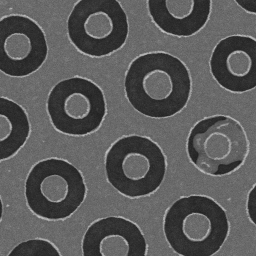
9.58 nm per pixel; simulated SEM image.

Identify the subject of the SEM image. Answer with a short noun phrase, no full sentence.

ring-shaped grooves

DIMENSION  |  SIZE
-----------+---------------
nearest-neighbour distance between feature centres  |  786 nm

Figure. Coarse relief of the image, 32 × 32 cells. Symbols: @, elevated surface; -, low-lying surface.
@@@@@@@@@@-----@@@@--@@@--@@@@--
@@@@@@@@@---@---@@@--@@@--@@@@@-
----@@@@@--@@@--@@@-------@@@@@@
-----@@@@--@@@--@@@@-----@@@@@@@
-@@---@@@--@@---@@@@@@@@@@@@@-@@
-@@@--@@@------@@@@@@@@@@@@-----
-@@@--@@@@----@@@@@@@@@@@@@--@@-
------@@@@@@@@@@@-----@@@@--@@@-
-----@@@@@@@@@@@-------@@@--@@@-
@@@@@@@@@@@@@@@@--@@@---@@@-----
@@@@@@@-----@@@@--@@@---@@@@----
@@@@@@-------@@@--@@@---@@@@@@@@
-@@@@@--@@@--@@@-------@@@@@@@@@
---@@@--@@@--@@@@------@@@@@@@@@
@--@@@---@@--@@@@@@--@@@@@@@@@@@
@---@@@-----@@@@@@@@@@@@@-----@@
@---@@@@---@@@@@@@@@@@@@------@@
---@@@@@@@@@@@@----@@@@@--@@@@@@
--@@@@@@@@@@@@------@@@@--@@@@@@
-@@@@@@@@@@@@---@@--@@@@--@@@--@
@@@@@----@@@@--@@@@--@@@-@----@@
@@@@------@@@--@@@---@@@@@---@@@
@@@---@@--@@@@------@@@@@@@@@@@@
@@@--@@@---@@@@-----@@@@@@@@@@@@
@@@---@@---@@@@@-@@@@@@@@@@@@@@-
@@@@------@@@@@@@@@@@@-----@@@@-
@@@@-----@@@@@@@@@@@@-------@@@-
@@@@@@@@@@@@@---@@@@@--@@@--@@@-
@@@@@@@@@@@------@@@@--@@@---@@@
@@@@@@@@@@@---@---@@@--@@@--@@@@
@@----@@@@---@@@--@@@-------@@@@
@------@@@---@@@--@@@@-----@@@@@